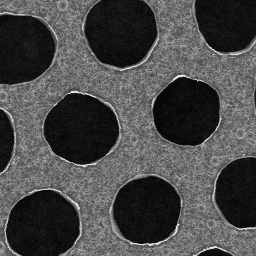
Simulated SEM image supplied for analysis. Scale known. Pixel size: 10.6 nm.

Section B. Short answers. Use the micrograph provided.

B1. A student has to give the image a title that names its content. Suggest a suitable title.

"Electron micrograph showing holes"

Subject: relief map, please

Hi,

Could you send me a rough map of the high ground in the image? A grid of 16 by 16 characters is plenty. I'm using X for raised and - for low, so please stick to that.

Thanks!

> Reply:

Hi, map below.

XXXXXX---XXX----
---XX-----XX----
---XX-----XXX---
---XXX---XXXXXXX
---XXXXXXXXXXXXX
XXXXXXXXXX---XXX
XXXX---XXX----XX
-XX----XXX----XX
-XX----XXX---XXX
-XX----XXXXXXXXX
XXXXXXXXXXXXXX--
XXXXXXXX---XXX--
X---XXX----XX---
X----XX----XXX--
-----XXX---XXXXX
X---XXXXXXXXXXXX